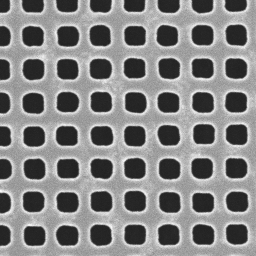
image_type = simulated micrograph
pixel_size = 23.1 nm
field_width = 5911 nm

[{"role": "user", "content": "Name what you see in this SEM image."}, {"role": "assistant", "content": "a regular array of holes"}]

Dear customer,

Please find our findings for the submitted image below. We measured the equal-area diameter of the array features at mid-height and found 531 nm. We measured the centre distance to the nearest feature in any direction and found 32.5 px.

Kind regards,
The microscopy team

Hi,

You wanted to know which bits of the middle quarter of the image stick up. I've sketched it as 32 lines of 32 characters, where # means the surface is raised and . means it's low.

....##......###......##......###
....##......###......##......###
....##......###......###.....###
...####....#####....####....####
################################
################################
################################
...####....#####....####....####
....###.....###......##......###
....###.....###......##......###
....##......###......##......###
...####.....####....####.....###
################################
################################
################################
..######...#####...#####....####
...####.....###.....###......###
....##......###......##......###
....###.....###......##......###
...####.....###.....####.....###
..######...#####....#####...####
################################
################################
########.#######...######..#####
....###.....###.....####.....###
....##......###......###.....###
....##......###......###.....###
....###.....###.....####.....###
...####....#####...######....###
################################
################################
################################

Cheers